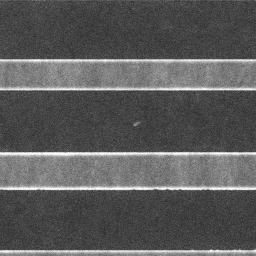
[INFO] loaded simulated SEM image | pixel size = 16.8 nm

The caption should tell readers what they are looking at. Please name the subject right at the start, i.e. lines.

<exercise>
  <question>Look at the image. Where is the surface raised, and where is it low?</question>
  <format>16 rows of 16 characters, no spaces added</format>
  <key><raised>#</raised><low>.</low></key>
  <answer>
................
................
................
................
################
################
................
................
................
................
################
################
................
................
................
................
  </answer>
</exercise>